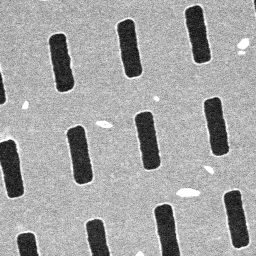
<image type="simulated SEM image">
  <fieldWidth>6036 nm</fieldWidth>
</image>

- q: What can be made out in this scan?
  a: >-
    holes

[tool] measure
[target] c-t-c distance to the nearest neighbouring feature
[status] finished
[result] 1640 nm